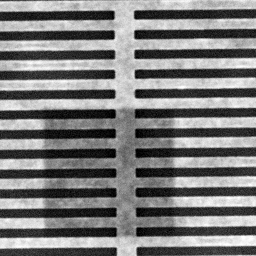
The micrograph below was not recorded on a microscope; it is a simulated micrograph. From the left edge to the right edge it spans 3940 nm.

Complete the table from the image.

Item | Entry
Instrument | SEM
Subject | groups of lines, slits or small figures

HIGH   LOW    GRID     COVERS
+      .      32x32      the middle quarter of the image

++++++++++++++++++++++++++++++++
.............+++++..............
.............++++...............
.............+++++..............
++++++++++++++++++++++++++++++++
++++++++++++++++++++++++++++++++
.............+++++..............
.............++++...............
.............+++++..............
++++++++++++++++++++++++++++++++
++++++++++++++++++++++++++++++++
.............+++++..............
.............++++...............
.............+++++..............
++++++++++++++++++++++++++++++++
++++++++++++++++++++++++++++++++
.............+++++..............
.............+++++..............
.............+++++..............
++++++++++++++++++++++++++++++++
++++++++++++++++++++++++++++++++
.............+++++..............
.............+++++..............
.............+++++..............
++++++++++++++++++++++++++++++++
++++++++++++++++++++++++++++++++
.............+++++..............
.............+++++..............
.............+++++...........+++
++++++++++++++++++++++++++++++++
++++++++++++++++++++++++++++++++
.............+++++..............